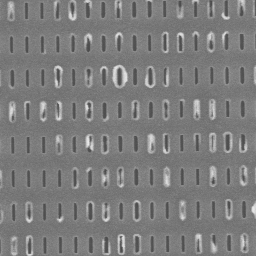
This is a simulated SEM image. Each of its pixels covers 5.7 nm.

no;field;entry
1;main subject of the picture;a regular array of holes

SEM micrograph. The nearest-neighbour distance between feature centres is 15.1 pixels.